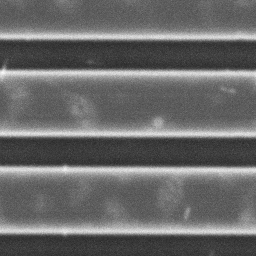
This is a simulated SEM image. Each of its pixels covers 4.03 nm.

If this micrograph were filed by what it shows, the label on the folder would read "one or a few lines or trenches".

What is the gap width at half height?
0.136 µm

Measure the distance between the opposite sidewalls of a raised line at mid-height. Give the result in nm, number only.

256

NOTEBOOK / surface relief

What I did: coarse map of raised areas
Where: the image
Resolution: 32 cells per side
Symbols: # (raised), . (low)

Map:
################################
################################
################################
################################
################################
................................
................................
................................
................................
################################
################################
################################
################################
################################
################################
################################
################################
................................
................................
................................
................................
################################
################################
################################
################################
################################
################################
################################
################################
................................
................................
................................